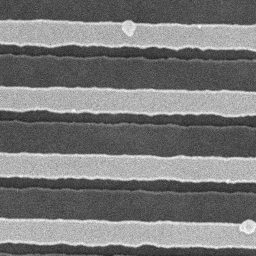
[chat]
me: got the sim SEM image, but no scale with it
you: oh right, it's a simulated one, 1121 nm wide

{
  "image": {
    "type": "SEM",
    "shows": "lines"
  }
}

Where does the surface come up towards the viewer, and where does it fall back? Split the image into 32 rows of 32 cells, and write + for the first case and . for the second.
................................
................................
.+..+++.........................
++++++++++++++++++++++++++++++++
++++++++++++++++++++++++++++++++
++++++++++++++++++++++++++++++++
................................
................................
................................
................................
................................
+++++++++++++++++++++++++++++++.
++++++++++++++++++++++++++++++++
++++++++++++++++++++++++++++++++
............................++..
................................
................................
................................
................................
++++++++++++++++++++..+.........
++++++++++++++++++++++++++++++++
++++++++++++++++++++++++++++++++
..............++++++.+++++++++++
................................
................................
................................
................................
++++++.+........................
++++++++++++++++++++++++++++++++
++++++++++++++++++++++++++++++++
....+++.++++++++++++++++++++++++
................................